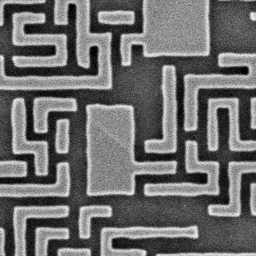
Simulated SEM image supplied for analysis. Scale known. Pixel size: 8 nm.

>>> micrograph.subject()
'wiring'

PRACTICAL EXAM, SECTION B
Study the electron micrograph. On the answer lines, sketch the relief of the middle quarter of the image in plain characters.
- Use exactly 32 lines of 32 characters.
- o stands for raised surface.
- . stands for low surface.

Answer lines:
....oo...ooo....................
.........ooo.............ooo....
.........ooo.............ooo....
oooooooooooo.............ooo..oo
oooooooooooo.............ooo..oo
oooooooooooo.............ooo..oo
.........................ooo..oo
.........................ooo..oo
.........................ooo..oo
ooo......................ooo..oo
ooo...oooo..ooo..........ooo..oo
ooo...ooooooooooo........ooo..oo
......ooooooooooo........ooo..oo
......ooooooooooo........ooo..oo
o.....ooooooooooo........ooo..oo
o.....ooooooooooo........ooo..oo
o.....ooooooooooo........ooo....
o.....ooooooooooo........ooo....
o.....ooooooooooo........ooo....
o.....ooooooooooo...oooooooo...o
o.....ooooooooooo...oooooooo...o
o.....ooooooooooo...oooooooo...o
......ooooooooooo..............o
......ooooooooooo..............o
......oooooooooooo........oo...o
o.....oooooooooooooooooooooo...o
o.....oooooooooooooooooooooo...o
o.....oooooooooooo..............
o.....ooooooooooo...............
o.....oooooooooooo..............
o.....oooooooooooo..oooooooooooo
o.....ooooooooooo...oooooooooooo